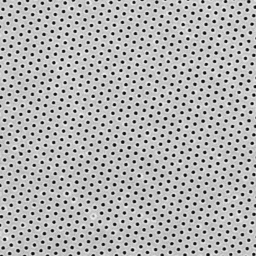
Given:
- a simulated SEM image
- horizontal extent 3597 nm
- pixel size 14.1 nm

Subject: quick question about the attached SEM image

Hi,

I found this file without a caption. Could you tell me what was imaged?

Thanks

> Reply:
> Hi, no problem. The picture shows a regular array of holes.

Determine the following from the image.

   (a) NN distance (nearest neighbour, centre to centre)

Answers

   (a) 118 nanometers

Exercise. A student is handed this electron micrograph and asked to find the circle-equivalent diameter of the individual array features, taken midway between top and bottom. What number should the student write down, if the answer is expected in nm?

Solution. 50.2